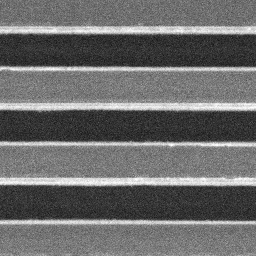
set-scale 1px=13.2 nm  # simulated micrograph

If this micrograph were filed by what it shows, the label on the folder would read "lines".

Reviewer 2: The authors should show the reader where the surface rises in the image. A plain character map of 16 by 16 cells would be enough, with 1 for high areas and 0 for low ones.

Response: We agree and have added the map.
1111111111111111
1111111111111111
0000000000000000
0000000000000000
1111111111111111
1111111111111111
1111111111111111
0000000000000000
0000000000000000
1111111111111111
1111111111111111
0000000000000000
0000000000000000
0000000000000000
1111111111111111
1111111111111111